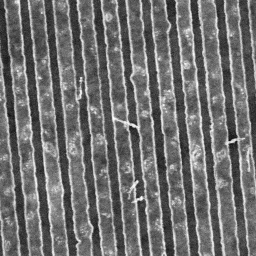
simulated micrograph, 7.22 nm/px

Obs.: parallel lines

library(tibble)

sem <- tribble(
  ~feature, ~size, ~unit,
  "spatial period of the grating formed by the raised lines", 24.2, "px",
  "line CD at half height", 108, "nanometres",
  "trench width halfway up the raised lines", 65.5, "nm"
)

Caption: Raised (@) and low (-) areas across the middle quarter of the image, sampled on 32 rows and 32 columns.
@@---@@@@--@@@@--@@@@--@@@@--@@@
@@@--@@@@--@@@@--@@@@---@@@---@@
@@@--@@@@--@@@@--@@@@--@@@@--@@@
@@@--@@@@--@@@@--@@@@---@@@---@@
@@@---@@@---@@@--@@@@---@@@---@@
@@@---@@@---@@@--@@@@---@@@---@@
@@@--@@@@---@@@---@@@---@@@---@@
@@@---@@@---@@@---@@@---@@@---@@
@@@---@@@---@@@@--@@@---@@@@--@@
@@@@--@@@---@@@@--@@@@--@@@@--@@
@@@@--@@@---@@@@--@@@@--@@@@--@@
@@@@--@@@@--@@@@--@@@@--@@@@--@@
@@@@--@@@@--@@@@--@@@@--@@@@--@@
@@@@--@@@@--@@@@--@@@@--@@@@---@
@@@@--@@@@--@@@@---@@@---@@@---@
@@@@---@@@---@@@--@@@@--@@@@---@
@@@@---@@@---@@@---@@@--@@@@@--@
@@@@---@@@---@@@---@@@---@@@@--@
-@@@---@@@---@@@---@@@---@@@@--@
@@@@---@@@@--@@@@--@@@---@@@@--@
-@@@@--@@@@--@@@@--@@@---@@@@--@
-@@@@--@@@@--@@@@--@@@@--@@@@---
-@@@@--@@@@--@@@@--@@@@--@@@@---
-@@@@--@@@@--@@@@--@@@@--@@@@---
-@@@@--@@@@---@@@--@@@@---@@@---
-@@@@--@@@@---@@@---@@@---@@@---
-@@@@--@@@@---@@@---@@@---@@@---
-@@@@---@@@---@@@---@@@---@@@---
--@@@---@@@---@@@---@@@---@@@@--
--@@@---@@@---@@@@--@@@---@@@@--
--@@@@--@@@---@@@@--@@@@--@@@@--
--@@@@--@@@---@@@@--@@@@--@@@@--